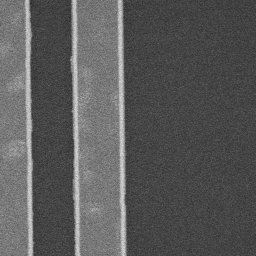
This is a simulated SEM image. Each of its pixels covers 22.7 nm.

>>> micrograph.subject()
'one or a few lines or trenches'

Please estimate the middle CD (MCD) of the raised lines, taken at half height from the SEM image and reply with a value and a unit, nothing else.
1.02 um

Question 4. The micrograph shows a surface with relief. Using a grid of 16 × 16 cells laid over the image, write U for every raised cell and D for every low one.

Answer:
UUDDDUUDDDDDDDDD
UUDDDUUDDDDDDDDD
UUDDDUUDDDDDDDDD
UUDDDUUDDDDDDDDD
UUDDDUUUDDDDDDDD
UUDDDUUUDDDDDDDD
UUDDDUUUDDDDDDDD
UUDDDUUUDDDDDDDD
UUDDDUUUDDDDDDDD
UUDDDUUUDDDDDDDD
UUDDDUUUDDDDDDDD
UUDDDUUUDDDDDDDD
UUDDDUUUDDDDDDDD
UUDDDUUUDDDDDDDD
UUDDDUUUDDDDDDDD
UUDDDUUUDDDDDDDD